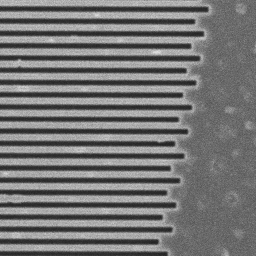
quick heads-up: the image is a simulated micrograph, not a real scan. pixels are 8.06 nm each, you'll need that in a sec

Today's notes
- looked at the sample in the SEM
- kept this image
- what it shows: parallel lines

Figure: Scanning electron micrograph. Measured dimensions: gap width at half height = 0.0413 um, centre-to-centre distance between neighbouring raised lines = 98.7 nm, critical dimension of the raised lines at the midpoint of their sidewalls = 55.4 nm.